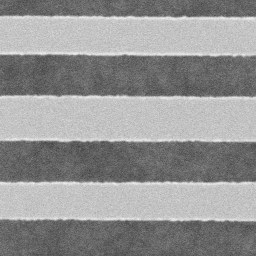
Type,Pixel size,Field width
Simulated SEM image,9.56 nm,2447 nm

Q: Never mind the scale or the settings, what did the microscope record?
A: lines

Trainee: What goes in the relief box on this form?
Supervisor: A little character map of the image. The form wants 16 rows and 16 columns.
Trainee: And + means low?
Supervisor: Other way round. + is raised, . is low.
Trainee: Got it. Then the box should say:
................
++++++++++++++++
++++++++++++++++
................
................
................
++++++++++++++++
++++++++++++++++
++++++++++++++++
................
................
++++++++++++++++
++++++++++++++++
++++++++++++++++
................
................